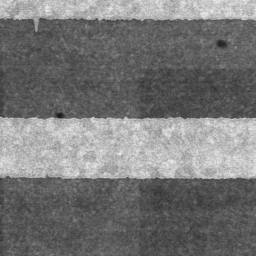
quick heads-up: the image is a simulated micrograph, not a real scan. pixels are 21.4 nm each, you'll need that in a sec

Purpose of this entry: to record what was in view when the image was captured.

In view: one or a few lines or trenches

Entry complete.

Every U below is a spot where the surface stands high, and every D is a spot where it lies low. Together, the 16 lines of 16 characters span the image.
UUUUUUUUUUUUUUUU
DDDDDDDDDDDDDDDD
DDDDDDDDDDDDDDDD
DDDDDDDDDDDDDDDD
DDDDDDDDDDDDDDDD
DDDDDDDDDDDDDDDD
DDDDDDDDDDDDDDDD
UUUUUUUUUUUUUUUU
UUUUUUUUUUUUUUUU
UUUUUUUUUUUUUUUU
UUUUUUUUUUUUUUUU
DDDDDDDDDDDDDDDD
DDDDDDDDDDDDDDDD
DDDDDDDDDDDDDDDD
DDDDDDDDDDDDDDDD
DDDDDDDDDDDDDDDD